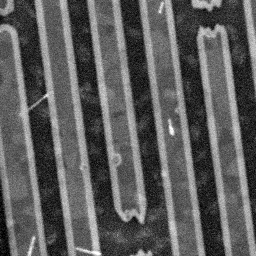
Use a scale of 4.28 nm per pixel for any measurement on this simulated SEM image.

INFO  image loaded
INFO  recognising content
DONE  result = parallel lines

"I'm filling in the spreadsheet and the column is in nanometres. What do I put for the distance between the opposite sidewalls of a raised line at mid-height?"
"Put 104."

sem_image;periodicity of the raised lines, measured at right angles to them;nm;222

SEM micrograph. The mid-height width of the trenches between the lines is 116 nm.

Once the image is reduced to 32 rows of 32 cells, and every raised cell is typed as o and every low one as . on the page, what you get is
o....ooo...oooo...ooo....oo....o
.....ooo...oooo...ooo..........o
.....ooo....ooo...ooo..........o
o....ooo....ooo...ooo..........o
oo...ooo....ooo...ooo....ooo...o
oo....ooo...ooo....ooo...ooo....
oo....ooo...ooo....ooo...ooo....
oo....ooo...ooo....ooo...ooo....
oo....ooo...oooo...ooo....oo....
oo....ooo....ooo...ooo....ooo...
ooo...ooo....ooo...ooo....ooo...
ooo...ooo....ooo...ooo....ooo...
ooo...oooo...ooo....ooo...ooo...
ooo....ooo...ooo....ooo...ooo...
ooo....ooo...ooo....ooo...ooo...
ooo....ooo...oooo...ooo...ooo...
ooo....ooo...oooo...ooo....ooo..
oooo...ooo....ooo...ooo....ooo..
oooo...ooo....ooo...ooo....ooo..
oooo...ooo....ooo...oooo...ooo..
oooo....ooo...ooo....ooo...ooo..
oooo....ooo...ooo....ooo...ooo..
.ooo....ooo...ooo....ooo...ooo..
.ooo....ooo...oooo...ooo....oo..
.ooo....ooo....ooo...ooo....ooo.
.oooo...ooo....ooo...ooo....ooo.
.oooo...ooo....ooo...ooo....ooo.
.oooo...oooo..........ooo...ooo.
.oooo....ooo..........ooo...ooo.
..ooo....ooo..........ooo...ooo.
..ooo....ooo..........ooo...ooo.
..ooo....ooo..........ooo....ooo